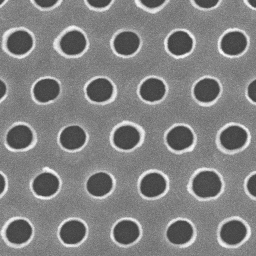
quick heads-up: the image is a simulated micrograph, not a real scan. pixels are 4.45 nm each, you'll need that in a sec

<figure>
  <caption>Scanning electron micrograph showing a regular array of holes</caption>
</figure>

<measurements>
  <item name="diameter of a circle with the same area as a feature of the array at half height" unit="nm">112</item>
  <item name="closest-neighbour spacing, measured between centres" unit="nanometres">237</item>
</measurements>